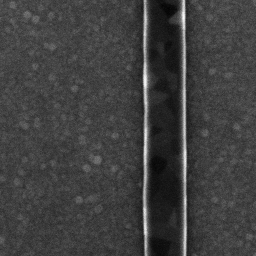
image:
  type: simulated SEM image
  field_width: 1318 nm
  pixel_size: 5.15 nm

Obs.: one or a few lines or trenches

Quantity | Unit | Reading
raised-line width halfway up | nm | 205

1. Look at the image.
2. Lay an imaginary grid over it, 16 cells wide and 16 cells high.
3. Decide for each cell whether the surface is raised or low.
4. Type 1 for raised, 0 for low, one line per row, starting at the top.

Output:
0000000001100000
0000000001100000
0000000001110000
0000000001110000
0000000001110000
0000000001100000
0000000001100000
0000000001100000
0000000001110000
0000000001110000
0000000001110000
0000000001110000
0000000001110000
0000000001110000
0000000001110000
0000000001110000